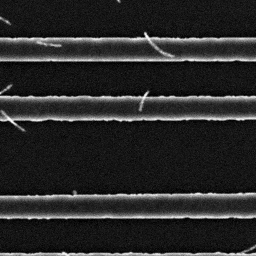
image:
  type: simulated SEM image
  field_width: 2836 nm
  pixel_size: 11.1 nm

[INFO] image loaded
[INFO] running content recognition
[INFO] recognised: lines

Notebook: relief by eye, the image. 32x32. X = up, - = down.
--------------------------------
--------------------------------
--------------------------------
--------------------------------
--------------------------------
XXXXXXXXXXXXXXXXXXXXXXXXXXXXXXXX
XXXXXXXXXXXXXXXXXXXXXXXXXXXXXXXX
XXXXXXXXXXXXXXXXXXXXXXXXXXXXXXXX
--------------------------------
--------------------------------
--------------------------------
--------------------------------
XXXXXXXXXXXXXXXXXXXXXXXXXXXXXXXX
XXXXXXXXXXXXXXXXXXXXXXXXXXXXXXXX
XXXXXXXXXXXXXXXXXXXXXXXXXXXXXXXX
--------------------------------
--------------------------------
--------------------------------
--------------------------------
--------------------------------
--------------------------------
--------------------------------
--------------------------------
--------------------------------
---XX-XXXXXXXXXXXXXXXXXXXXXXXXXX
XXXXXXXXXXXXXXXXXXXXXXXXXXXXXXXX
XXXXXXXXXXXXXXXXXXXXXXXXXXXXXXXX
--------------------------------
--------------------------------
--------------------------------
--------------------------------
--------------------------------